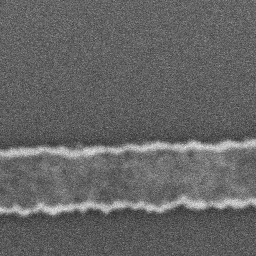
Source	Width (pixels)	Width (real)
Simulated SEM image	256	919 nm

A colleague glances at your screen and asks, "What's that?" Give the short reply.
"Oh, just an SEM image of one or a few lines or trenches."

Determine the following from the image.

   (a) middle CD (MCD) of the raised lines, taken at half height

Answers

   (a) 209 nanometers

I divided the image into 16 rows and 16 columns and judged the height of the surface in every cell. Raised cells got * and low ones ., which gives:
................
................
................
................
................
................
................
................
................
.***.***********
****************
****************
****************
................
................
................